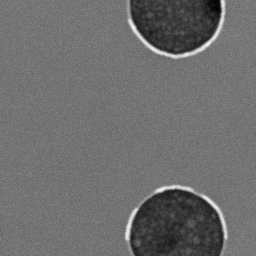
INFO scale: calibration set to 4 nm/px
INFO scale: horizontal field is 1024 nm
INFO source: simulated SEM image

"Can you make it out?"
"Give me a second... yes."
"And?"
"holes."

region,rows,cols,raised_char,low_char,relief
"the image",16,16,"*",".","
********......**
********......**
*********....***
****************
****************
****************
****************
****************
****************
****************
****************
****************
*********....***
********......**
********......**
********......**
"